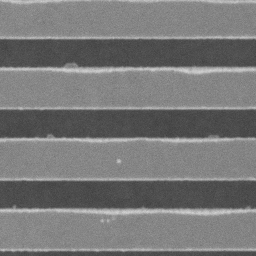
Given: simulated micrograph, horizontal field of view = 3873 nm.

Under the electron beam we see lines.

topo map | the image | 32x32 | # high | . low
################################
################################
################################
################################
################################
................................
................................
................................
................................
################################
################################
################################
################################
################################
................................
................................
................................
################################
################################
################################
################################
################################
................................
................................
................................
................................
################################
################################
################################
################################
################################
................................